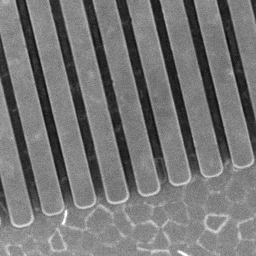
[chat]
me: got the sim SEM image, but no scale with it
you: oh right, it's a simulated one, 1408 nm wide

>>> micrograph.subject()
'parallel lines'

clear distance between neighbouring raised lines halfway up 56.2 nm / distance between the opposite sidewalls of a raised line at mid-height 122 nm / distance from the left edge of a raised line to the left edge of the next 179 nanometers